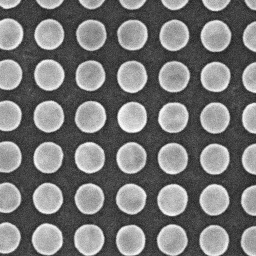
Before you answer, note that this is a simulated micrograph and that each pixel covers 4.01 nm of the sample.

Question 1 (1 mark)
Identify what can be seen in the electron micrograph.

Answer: a regular array of raised bodies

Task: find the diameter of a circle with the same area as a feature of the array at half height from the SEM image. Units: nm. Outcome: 120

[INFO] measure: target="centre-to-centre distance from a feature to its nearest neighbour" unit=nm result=164